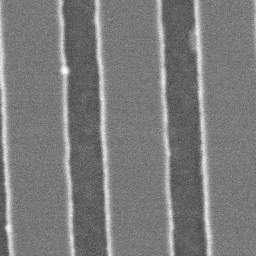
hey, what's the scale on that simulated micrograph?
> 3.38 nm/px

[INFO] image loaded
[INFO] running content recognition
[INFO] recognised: lines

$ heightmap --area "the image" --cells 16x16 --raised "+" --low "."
++++..++++..++++
++++..++++..++++
++++..++++..++++
++++..++++..++++
++++..++++..++++
++++..++++..++++
++++..++++..++++
++++..++++...+++
++++..++++...+++
++++..+++++..+++
++++...++++..+++
++++...++++..+++
++++...++++..+++
++++...++++..+++
+++++..++++..+++
.++++..++++..+++